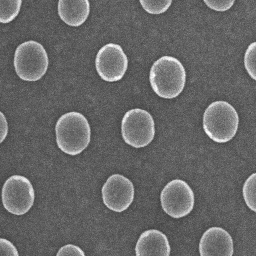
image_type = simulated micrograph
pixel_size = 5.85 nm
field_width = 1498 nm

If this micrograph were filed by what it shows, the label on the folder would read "a regular array of raised bodies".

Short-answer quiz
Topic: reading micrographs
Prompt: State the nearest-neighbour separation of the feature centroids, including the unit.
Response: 349 nanometres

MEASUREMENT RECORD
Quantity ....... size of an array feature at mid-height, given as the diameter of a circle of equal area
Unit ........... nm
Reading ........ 207